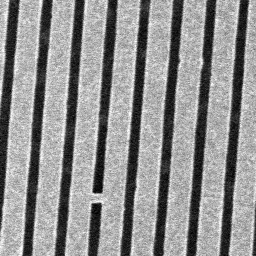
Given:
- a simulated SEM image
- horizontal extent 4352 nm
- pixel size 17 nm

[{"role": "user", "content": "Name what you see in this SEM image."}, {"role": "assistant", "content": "parallel lines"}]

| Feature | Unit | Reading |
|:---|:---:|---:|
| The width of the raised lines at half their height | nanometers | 358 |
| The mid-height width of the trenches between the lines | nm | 199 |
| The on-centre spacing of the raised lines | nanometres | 556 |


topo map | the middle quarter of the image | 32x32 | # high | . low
#...#####...######..######...###
#...#####...#####...######...###
#...#####...#####...######...###
#...#####...#####...######..####
#...#####...#####...#####...####
#...#####...#####...#####...####
#...#####...#####...#####...####
#...#####...#####...#####...####
#...#####...#####...#####...####
....#####...#####...#####...####
...#####....#####...#####...####
...#####....#####...#####...####
...#####...######...#####...####
...#####...#####...######...####
...#####...#####...######...####
...#####...#####...######...####
...#####...#####...#####....####
...#####...#####...#####....####
...#####...#####...#####...#####
...#####...#####...#####...#####
...#####...#####...#####...#####
...#####...#####...#####...#####
...#####..######...#####...#####
...#####..######...#####...#####
...#####..######...#####...#####
..######..######...#####...#####
..#####...#####...######...#####
..#####...#####....#####...#####
..#####...#####...######...#####
..#####...#####...#####....#####
..#####...#####...#####....#####
..#####...#####...#####...######